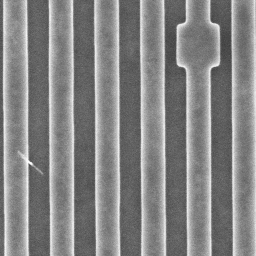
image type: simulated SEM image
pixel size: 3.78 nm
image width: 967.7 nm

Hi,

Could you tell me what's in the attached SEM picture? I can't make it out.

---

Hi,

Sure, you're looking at wiring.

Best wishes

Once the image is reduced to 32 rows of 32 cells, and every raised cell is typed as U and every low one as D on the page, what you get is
UUUDDDUUUDDDUUUDDDUUDDDUUUDDDUUU
UUUDDDUUUDDDUUUDDDUUDDDUUUDDDUUU
UUUDDDUUUDDDUUUDDDUUDDDUUUDDDUUU
UUUDDDUUUDDDUUUDDDUUDDUUUUUDDUUU
UUUDDDUUUDDDUUUDDDUUDDUUUUUDDUUU
UUUDDDUUUDDDUUUDDDUUDDUUUUUDDUUU
UUUDDDUUUDDDUUUDDDUUDDUUUUUDDUUU
UUUDDDUUUDDDUUUDDDUUDDUUUUUDDUUU
UUUDDDUUUDDDUUUDDDUUDDDUUUUDDUUU
UUUDDDUUUDDDUUUDDDUUDDDUUUDDDUUU
UUUDDDUUUDDDUUUDDDUUDDDUUUDDDUUU
UUUDDDUUUDDDUUUDDDUUDDDUUUDDDUUU
UUUDDDUUUDDDUUUDDDUUDDDUUUDDDUUU
UUUDDDUUUDDDUUUDDDUUDDDUUUDDDUUU
DUUDDDUUUDDDUUUDDDUUDDDUUUDDDUUU
DUUDDDUUUDDDUUUDDDUUDDDUUUDDDUUU
DUUDDDUUUDDDUUUDDDUUDDDUUUDDDUUU
DUUDDDUUUDDDUUUDDDUUDDDUUUDDDUUU
DUUDDDUUUDDDUUUDDDUUDDDUUUDDDUUU
DUUDDDUUUDDDUUUDDDUUUDDUUUDDDUUU
DUUUDDUUUDDDUUUDDDUUUDDUUUDDDUUU
DUUDDDUUUDDDUUUDDDUUUDDUUUDDDUUU
DUUDDDUUUDDDUUUDDDUUUDDUUUDDDUUU
DUUDDDUUUDDDUUUDDDUUUDDUUUDDDUUU
DUUDDDUUUDDDUUUDDDUUUDDUUUDDDUUU
DUUDDDUUUDDDUUUDDDUUUDDUUUDDDUUU
DUUDDDUUUDDDUUUDDDUUUDDUUUDDDUUU
DUUDDDUUUDDDUUUDDDUUUDDUUUDDDUUU
DUUDDDUUUDDDUUUDDDUUUDDUUUDDDUUU
DUUDDDUUUDDDUUUDDDUUUDDUUUDDDUUU
DUUDDDUUUDDDUUUDDDUUUDDUUUDDDUUU
DUUUDDUUUDDDUUUDDDUUUDDUUUDDDUUU